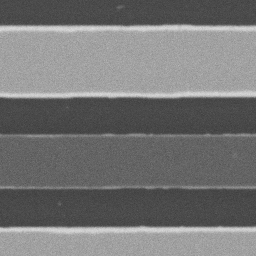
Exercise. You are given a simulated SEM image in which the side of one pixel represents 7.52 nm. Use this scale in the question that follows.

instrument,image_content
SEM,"lines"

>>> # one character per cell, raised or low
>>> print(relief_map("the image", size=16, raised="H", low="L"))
LLLLLLLLLLLLLLLL
LLLLLLLLLLLLLLLL
HHHHHHHHHHHHHHHH
HHHHHHHHHHHHHHHH
HHHHHHHHHHHHHHHH
HHHHHHHHHHHHHHHH
LLLLLLLLLLLLLLLL
LLLLLLLLLLLLLLLL
HHHHHHHHHHHHHHHH
HHHHHHHHHHHHHHHH
HHHHHHHHHHHHHHHH
HHHHHHHHHHHHHHHH
LLLLLLLLLLLLLLLL
LLLLLLLLLLLLLLLL
HHHHHHHHHHHHHHHH
HHHHHHHHHHHHHHHH